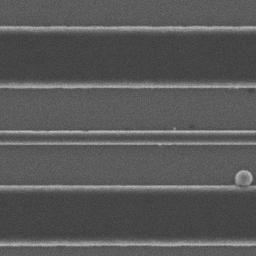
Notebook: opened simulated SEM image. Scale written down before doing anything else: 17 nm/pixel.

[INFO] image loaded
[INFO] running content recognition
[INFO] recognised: lines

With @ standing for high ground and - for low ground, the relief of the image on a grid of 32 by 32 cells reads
--------------------------------
--------------------------------
--------------------------------
@@@@@@@@@@@@@-@@@@@-@@@@@@@@@@@@
@@@@@@@@@@@@@@@@@@@@@@@@@@@@@@@@
@@@@@@@@@@@@@@@@@@@@@@@@@@@@@@@@
@@@@@@@@@@@@@@@@@@@@@@@@@@@@@@@@
@@@@@@@@@@@@@@@@@@@@@@@@@@@@@@@@
@@@@@@@@@@@@@@@@@@@@@@@@@@@@@@@@
@@@@@@@@@@@@@@@@@@@@@@@@@@@@@@@@
@@@@@@@@@@@@@@@@@@@@@@@@@@@@@@@@
--------------------------------
--------------------------------
--------------------------------
--------------------------------
--------------------------------
@@@@--@@@@-@@@@@@@@@@@@@@@@@@@@@
@@@@@@@@@@@@@@@@@@@@@@@@@@@@@@@@
--------------------------------
--------------------------------
--------------------------------
------------------------------@-
------------------------------@-
@@@@@@@@@@@@@@@@@@@@@@@@@@@@@@@@
@@@@@@@@@@@@@@@@@@@@@@@@@@@@@@@@
@@@@@@@@@@@@@@@@@@@@@@@@@@@@@@@@
@@@@@@@@@@@@@@@@@@@@@@@@@@@@@@@@
@@@@@@@@@@@@@@@@@@@@@@@@@@@@@@@@
@@@@@@@@@@@@@@@@@@@@@@@@@@@@@@@@
@@@@@@@@@@@@@@@@@@@@@@@@@@@@@@@@
@@@@@@@-@@@@@--@---@@@@-@----@@@
--------------------------------